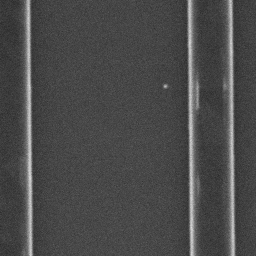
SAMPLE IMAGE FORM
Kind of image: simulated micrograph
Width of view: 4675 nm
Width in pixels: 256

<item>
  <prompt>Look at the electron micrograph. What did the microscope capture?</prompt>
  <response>wiring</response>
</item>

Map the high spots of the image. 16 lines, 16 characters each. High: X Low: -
XX----------XX--
XX----------XX--
XX----------XX--
XX----------XXX-
XX----------XXX-
XX----------XXX-
XX----------XXX-
XX----------XXX-
XX----------XXX-
XX----------XXX-
XX----------XXX-
XX----------XXX-
XX----------XXX-
XX----------XXX-
XX----------XXX-
XX----------XXX-